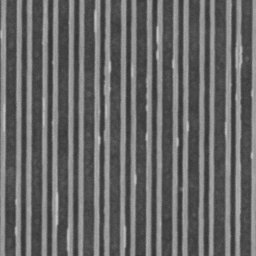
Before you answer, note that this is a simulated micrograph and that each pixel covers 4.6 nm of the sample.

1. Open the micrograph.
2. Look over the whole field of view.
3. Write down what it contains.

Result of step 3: parallel lines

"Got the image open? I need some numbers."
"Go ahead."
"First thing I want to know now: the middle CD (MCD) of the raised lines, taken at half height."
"21.3 nanometers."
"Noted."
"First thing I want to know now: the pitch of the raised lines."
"59.8 nm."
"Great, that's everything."